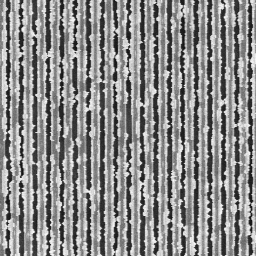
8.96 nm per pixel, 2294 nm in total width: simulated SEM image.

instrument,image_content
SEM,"parallel lines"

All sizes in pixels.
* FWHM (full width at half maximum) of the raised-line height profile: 8.88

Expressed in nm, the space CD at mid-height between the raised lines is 43.7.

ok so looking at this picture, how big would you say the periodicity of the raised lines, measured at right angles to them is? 121 nm